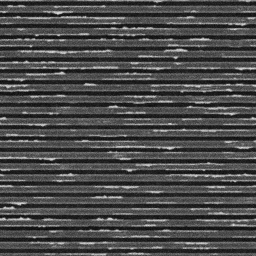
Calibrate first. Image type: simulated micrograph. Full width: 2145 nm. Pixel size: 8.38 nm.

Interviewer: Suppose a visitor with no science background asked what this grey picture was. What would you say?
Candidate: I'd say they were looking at parallel lines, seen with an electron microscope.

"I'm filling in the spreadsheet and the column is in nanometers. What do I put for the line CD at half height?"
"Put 57.6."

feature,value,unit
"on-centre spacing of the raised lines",94.2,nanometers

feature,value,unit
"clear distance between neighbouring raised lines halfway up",35.6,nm